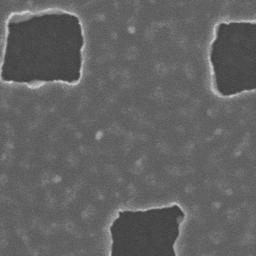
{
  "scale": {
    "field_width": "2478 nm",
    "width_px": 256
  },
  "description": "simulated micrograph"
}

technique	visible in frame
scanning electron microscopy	holes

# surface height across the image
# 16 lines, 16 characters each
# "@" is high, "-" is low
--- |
@@@@@@@@@@@@@@@@
@----@@@@@@@@@--
-----@@@@@@@@---
-----@@@@@@@@---
-----@@@@@@@@---
@@@@@@@@@@@@@@--
@@@@@@@@@@@@@@@@
@@@@@@@@@@@@@@@@
@@@@@@@@@@@@@@@@
@@@@@@@@@@@@@@@@
@@@@@@@@@@@@@@@@
@@@@@@@@@@@@@@@@
@@@@@@@@@@@@@@@@
@@@@@@@----@@@@@
@@@@@@@----@@@@@
@@@@@@@----@@@@@